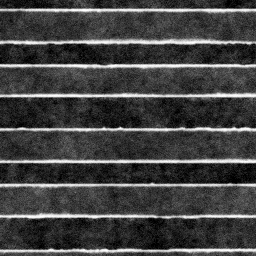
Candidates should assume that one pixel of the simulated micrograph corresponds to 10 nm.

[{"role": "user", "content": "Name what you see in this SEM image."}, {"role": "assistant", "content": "lines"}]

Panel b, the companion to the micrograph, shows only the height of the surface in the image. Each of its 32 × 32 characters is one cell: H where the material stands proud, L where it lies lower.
LLLLLLLLLLLLLLLLLLLLLLLLLLLLLLLL
HHHHHHHHHHHHHHHHHHHHHHHHHHHHHHHH
HHHHHHHHHHHHHHHHHHHHHHHHHHHHHHHH
HHHHHHHHHHHHHHHHHHHHHHHHHHHHHHHH
HHHHHHHHHHHHHHHHHHHHHHHHHHHHHHHH
LLLLLLLLLLLLLLLLLLLLLLLLLLLLLLLL
LLLLLLLLLLLLLLLLLLLLLLLLLLLLLLLL
LLLLLLLLLLLLLLLLLLLLLLLLLLLLLLLL
HHHHHHHHHHHHHHHHHHHHHHHHHHHHHHHH
HHHHHHHHHHHHHHHHHHHHHHHHHHHHHHHH
HHHHHHHHHHHHHHHHHHHHHHHHHHHHHHHH
HHHHHHHHHHHHHHHHHHHHHHHHHHHHHHHH
LLLLLLLLLLLLLLLLLLLLLLLLLLLLLLLL
LLLLLLLLLLLLLLLLLLLLLLLLLLLLLLLL
LLLLLLLLLLLLLLLLLLLLLLLLLLLLLLLL
LLLLLLLLLLLLLLLLLLLLLLLLLLLLLLLL
HHHHHHHHHHHHHHHHHHHHHHHHHHHHHHHH
HHHHHHHHHHHHHHHHHHHHHHHHHHHHHHHH
HHHHHHHHHHHHHHHHHHHHHHHHHHHHHHHH
HHHHHHHHHHHHHHHHHHHHHHHHHHHHHHHH
LLLLLLLLLLLLLLLLLLLLLLLLLLLLLLLL
LLLLLLLLLLLLLLLLLLLLLLLLLLLLLLLL
LLLLLLLLLLLLLLLLLLLLLLLLLLLLLLLL
HHHHHHHHHHHHHHHHHHHHHHHHHHHHHHHH
HHHHHHHHHHHHHHHHHHHHHHHHHHHHHHHH
HHHHHHHHHHHHHHHHHHHHHHHHHHHHHHHH
HHHHHHHHHHHHHHHHHHHHHHHHHHHHHHHH
LLLLLLLLLLLLLLLLLLLLLLLLLLLLLLLL
LLLLLLLLLLLLLLLLLLLLLLLLLLLLLLLL
LLLLLLLLLLLLLLLLLLLLLLLLLLLLLLLL
LLLLLLLLLLLLLLLLLLLLLLLLLLLLLLLL
HHHHHHHHHHHHHHHHHHHHHHHHHHHHHHHH